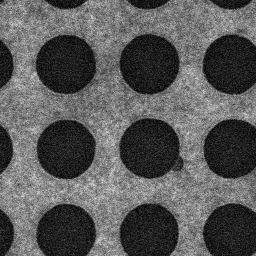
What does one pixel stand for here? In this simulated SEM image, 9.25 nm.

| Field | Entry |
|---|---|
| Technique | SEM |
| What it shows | holes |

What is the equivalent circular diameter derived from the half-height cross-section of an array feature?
559 nanometers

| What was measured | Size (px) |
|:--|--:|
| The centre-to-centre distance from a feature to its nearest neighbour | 84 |